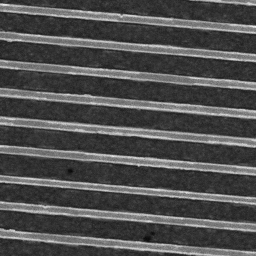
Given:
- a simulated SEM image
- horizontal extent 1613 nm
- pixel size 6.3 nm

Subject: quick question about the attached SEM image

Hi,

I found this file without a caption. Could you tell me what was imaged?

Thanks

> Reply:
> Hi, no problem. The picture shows parallel lines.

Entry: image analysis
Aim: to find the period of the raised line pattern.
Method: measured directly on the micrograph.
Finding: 0.177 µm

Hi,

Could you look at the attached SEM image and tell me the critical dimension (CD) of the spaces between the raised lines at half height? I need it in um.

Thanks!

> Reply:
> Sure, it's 0.135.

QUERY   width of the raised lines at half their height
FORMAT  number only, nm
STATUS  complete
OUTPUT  41.6